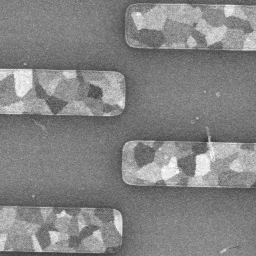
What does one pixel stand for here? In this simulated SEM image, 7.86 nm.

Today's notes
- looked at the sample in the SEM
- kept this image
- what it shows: groups of lines, slits or small figures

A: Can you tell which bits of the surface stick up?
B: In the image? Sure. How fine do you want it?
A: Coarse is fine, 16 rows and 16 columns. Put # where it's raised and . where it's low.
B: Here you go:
........########
........########
........########
................
#######.........
########........
########........
................
................
........########
........########
........########
................
########........
########........
#######.........